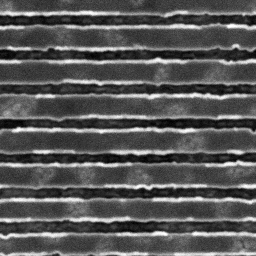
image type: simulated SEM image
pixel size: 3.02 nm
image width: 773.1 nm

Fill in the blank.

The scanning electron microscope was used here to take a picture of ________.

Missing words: parallel lines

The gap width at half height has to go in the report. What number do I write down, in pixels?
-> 10.3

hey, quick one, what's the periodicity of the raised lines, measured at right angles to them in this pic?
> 104 nanometers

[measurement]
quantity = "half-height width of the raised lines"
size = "73.3 nm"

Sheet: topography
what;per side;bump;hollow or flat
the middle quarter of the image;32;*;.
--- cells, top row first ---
********************************
********************************
********************************
********************************
********************************
................................
................................
....................*..*........
********************************
********************************
********************************
********************************
********************************
.................********..**...
................................
................................
*********..*********************
********************************
********************************
********************************
********************************
********************************
.......**....***.****.****......
................................
...........................*....
********************************
********************************
********************************
********************************
********************************
********************************
................................